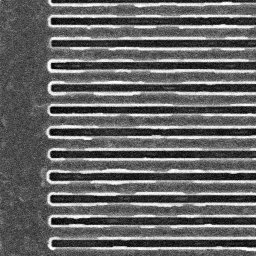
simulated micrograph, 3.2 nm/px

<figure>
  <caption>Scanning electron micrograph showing parallel lines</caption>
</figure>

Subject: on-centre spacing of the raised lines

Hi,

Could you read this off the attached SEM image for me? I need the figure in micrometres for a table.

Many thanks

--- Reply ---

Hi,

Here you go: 0.0711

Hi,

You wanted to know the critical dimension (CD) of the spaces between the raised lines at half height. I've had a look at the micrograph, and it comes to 24.8 nm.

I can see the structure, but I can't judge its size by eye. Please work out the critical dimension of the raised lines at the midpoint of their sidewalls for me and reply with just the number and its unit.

46.4 nm